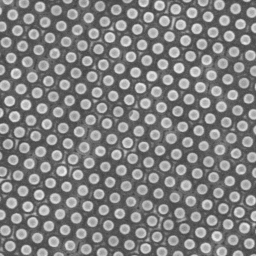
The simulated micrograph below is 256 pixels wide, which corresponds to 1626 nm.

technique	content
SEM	a regular array of raised bodies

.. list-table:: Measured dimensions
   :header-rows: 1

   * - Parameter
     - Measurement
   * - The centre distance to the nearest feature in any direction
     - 103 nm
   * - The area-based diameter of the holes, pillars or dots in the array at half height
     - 64.5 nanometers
